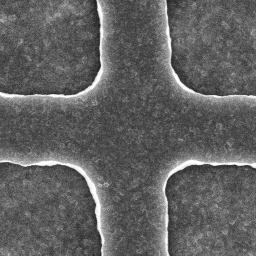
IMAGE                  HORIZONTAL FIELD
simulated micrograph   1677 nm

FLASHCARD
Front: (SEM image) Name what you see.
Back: holes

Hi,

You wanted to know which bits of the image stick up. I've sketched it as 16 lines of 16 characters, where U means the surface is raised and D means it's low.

DDDDDDUUUUDDDDDD
DDDDDDUUUUUDDDDD
DDDDDDUUUUUDDDDD
DDDDDDUUUUUDDDDD
DDDDDDUUUUUDDDDD
DDDDDDUUUUUUDDDD
UUUUUUUUUUUUUUUU
UUUUUUUUUUUUUUUU
UUUUUUUUUUUUUUUU
UUUUUUUUUUUUUUUU
DDDDDUUUUUUDDDDD
DDDDDDUUUUDDDDDD
DDDDDDUUUUDDDDDD
DDDDDDUUUUDDDDDD
DDDDDDUUUUDDDDDD
DDDDDDUUUUDDDDDD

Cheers